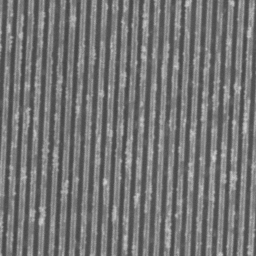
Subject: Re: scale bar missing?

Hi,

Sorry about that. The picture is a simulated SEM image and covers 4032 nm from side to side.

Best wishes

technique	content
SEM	parallel lines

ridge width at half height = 82.6 nanometres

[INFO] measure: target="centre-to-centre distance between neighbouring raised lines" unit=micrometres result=0.165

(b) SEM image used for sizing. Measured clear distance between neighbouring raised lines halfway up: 84.6 nanometres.